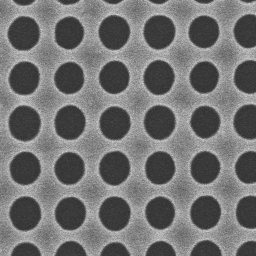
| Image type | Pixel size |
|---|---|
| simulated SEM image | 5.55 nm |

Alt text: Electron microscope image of a regular array of holes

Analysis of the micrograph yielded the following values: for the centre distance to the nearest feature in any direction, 0.249 µm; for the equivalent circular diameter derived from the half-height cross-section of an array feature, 0.179 micrometres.